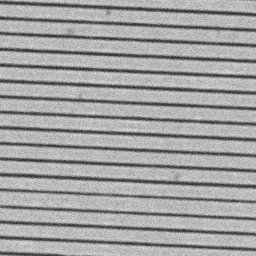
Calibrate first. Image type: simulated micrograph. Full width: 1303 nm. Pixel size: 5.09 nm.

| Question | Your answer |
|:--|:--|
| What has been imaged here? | parallel lines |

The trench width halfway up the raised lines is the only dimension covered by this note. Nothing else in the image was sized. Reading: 19.1 nm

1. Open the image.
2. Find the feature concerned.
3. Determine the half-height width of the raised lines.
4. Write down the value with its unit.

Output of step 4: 61.6 nm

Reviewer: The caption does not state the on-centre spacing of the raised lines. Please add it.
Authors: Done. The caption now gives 79.6 nm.